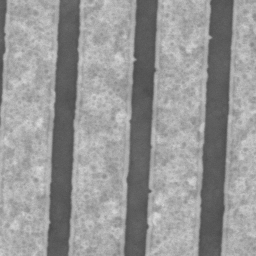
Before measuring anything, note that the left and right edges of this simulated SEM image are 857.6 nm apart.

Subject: one or a few lines or trenches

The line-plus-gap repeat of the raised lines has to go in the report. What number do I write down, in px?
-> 75.6